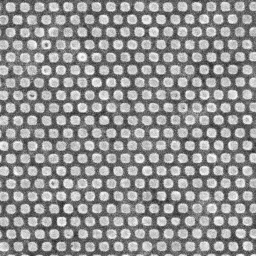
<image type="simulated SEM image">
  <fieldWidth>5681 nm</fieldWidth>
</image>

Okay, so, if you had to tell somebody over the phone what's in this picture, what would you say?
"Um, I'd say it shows a regular array of raised bodies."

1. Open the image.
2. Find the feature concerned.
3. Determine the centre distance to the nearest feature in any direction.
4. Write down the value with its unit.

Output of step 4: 313 nanometres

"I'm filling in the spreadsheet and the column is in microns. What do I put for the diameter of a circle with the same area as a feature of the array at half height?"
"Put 0.197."